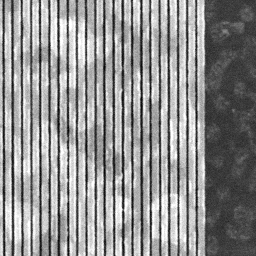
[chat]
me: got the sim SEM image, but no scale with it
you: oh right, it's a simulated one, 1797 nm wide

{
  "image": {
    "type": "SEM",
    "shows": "parallel lines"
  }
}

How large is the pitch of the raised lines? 0.0645 micrometres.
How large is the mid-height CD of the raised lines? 6.13 px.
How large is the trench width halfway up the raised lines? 18.4 nanometers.